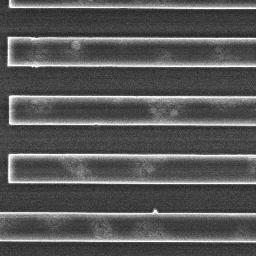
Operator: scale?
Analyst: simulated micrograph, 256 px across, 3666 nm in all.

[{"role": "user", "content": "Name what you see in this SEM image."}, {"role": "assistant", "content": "parallel lines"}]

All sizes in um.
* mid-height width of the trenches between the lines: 0.435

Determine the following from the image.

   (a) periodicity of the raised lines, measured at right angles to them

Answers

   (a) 836 nm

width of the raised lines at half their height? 406 nanometres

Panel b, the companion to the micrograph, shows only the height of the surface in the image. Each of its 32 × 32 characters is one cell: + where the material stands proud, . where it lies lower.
.+++++++++++++++++++++++++++++++
................................
................................
................................
................................
.+++++++++++++++++++++++++++++++
.+++++++++++++++++++++++++++++++
.+++++++++++++++++++++++++++++++
................................
................................
................................
................................
.+++++++++++++++++++++++++++++++
.+++++++++++++++++++++++++++++++
.+++++++++++++++++++++++++++++++
.........+++++++++++++++++++++++
................................
................................
................................
.++++++++++++++++++++++++++++...
.+++++++++++++++++++++++++++++++
.+++++++++++++++++++++++++++++++
.+++++++++++++++++++++++++++++++
................................
................................
................................
...................+............
++++++++++++++++++++++++++++++++
++++++++++++++++++++++++++++++++
++++++++++++++++++++++++++++++++
................................
................................